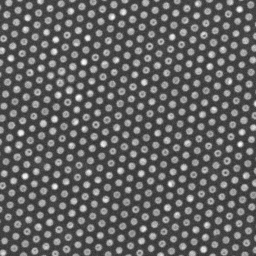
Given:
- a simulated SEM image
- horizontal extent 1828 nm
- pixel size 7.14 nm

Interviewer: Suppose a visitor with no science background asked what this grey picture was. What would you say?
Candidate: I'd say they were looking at a regular array of raised bodies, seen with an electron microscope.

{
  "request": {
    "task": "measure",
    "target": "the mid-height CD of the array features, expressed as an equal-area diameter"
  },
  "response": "44.9 nm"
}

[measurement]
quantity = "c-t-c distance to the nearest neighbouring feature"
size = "84.2 nm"